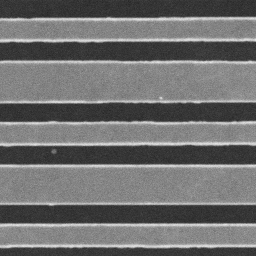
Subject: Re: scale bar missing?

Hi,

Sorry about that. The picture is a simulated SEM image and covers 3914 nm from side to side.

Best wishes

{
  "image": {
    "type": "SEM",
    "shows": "lines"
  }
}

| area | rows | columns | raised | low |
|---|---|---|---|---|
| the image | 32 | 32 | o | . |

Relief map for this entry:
................................
................................
oooooooooooooooooooooooooooooooo
oooooooooooooooooooooooooooooooo
oooooooooooooooooooooooooooooooo
................................
................................
................................
oooooooooooooooooooooooooooooooo
oooooooooooooooooooooooooooooooo
oooooooooooooooooooooooooooooooo
oooooooooooooooooooooooooooooooo
oooooooooooooooooooooooooooooooo
................................
................................
oooooooooooooooooooooooooooooooo
oooooooooooooooooooooooooooooooo
oooooooooooooooooooooooooooooooo
................................
................................
................................
oooooooooooooooooooooooooooooooo
oooooooooooooooooooooooooooooooo
oooooooooooooooooooooooooooooooo
oooooooooooooooooooooooooooooooo
oooooooooooooooooooooooooooooooo
................................
................................
oooooooooooooooooooooooooooooooo
oooooooooooooooooooooooooooooooo
oooooooooooooooooooooooooooooooo
................................